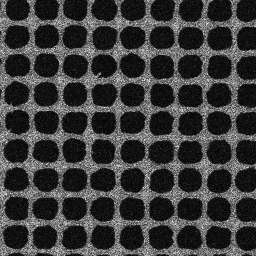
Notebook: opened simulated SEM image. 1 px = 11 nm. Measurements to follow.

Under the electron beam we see a regular array of holes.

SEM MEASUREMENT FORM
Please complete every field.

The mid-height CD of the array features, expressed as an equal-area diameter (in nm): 273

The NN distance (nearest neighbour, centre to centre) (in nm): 311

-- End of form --